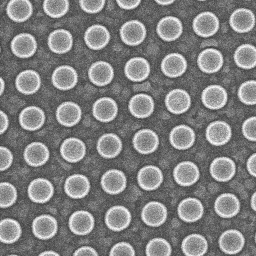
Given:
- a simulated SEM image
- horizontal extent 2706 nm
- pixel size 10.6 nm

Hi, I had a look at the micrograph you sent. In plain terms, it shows a regular array of raised bodies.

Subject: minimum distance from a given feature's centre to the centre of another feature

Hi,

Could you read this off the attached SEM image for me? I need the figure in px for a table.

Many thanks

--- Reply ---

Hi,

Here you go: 36.4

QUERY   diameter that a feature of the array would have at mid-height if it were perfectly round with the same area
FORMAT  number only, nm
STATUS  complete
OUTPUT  247